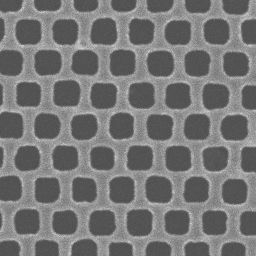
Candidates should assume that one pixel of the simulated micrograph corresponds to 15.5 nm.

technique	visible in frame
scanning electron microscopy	a regular array of holes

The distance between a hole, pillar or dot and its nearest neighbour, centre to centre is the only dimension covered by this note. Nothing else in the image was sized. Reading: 559 nm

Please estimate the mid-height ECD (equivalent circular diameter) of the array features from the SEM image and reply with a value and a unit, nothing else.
436 nanometers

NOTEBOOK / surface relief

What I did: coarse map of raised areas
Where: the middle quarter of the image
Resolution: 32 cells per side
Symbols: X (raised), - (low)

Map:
XX-------XX-------XXX-------XX--
XX-------XX-------XXX------XXX--
XXX-----XXXX-----XXXXX-----XXXX-
XXXXXXXXXXXXXXXXXXXXXXXXXXXXXXXX
---XXXXXXXXXXXXXXXXX-XXXXXXX-XXX
----XXX------XXXX-----XXXX------
----XXX------XXX-------XX-------
----XX-------XXX-------XX-------
----XXX------XXX-------XX-------
----XXX------XXX-------XX-------
---XXXX------XXXX-----XXXX------
XXXXXXXXX-XXXXXXXXXXXXXXXXXXXXXX
XXXX---XXXXXX---XXXXXX-XXXXXXXXX
XX------XXXX-----XXXX------XXXX-
XX------XXX-------XXX------XXX--
XX------XXX-------XXX------XXX--
XX------XXX-------XXX------XXX--
XX------XXX------XXXX------XXX--
XX-----XXXXX----XXXXXX-----XXX--
XXXXXXXXXXXXXXXXXXXXXXXXXXXXXXXX
--XXXXXXXXXXXXXXX----XXXXXX---XX
---XXXX-----XXXX------XXX-------
----XX-------XXX------XXX-------
----XX-------XXX------XXX-------
----XX-------XXX------XXX-------
----XXX-----XXXX------XXXX------
--XXXXXX----XXXX-----XXXXX-----X
XXXXXXXXXXXXXXXXXXXXXXXXXXXXXXXX
XXX----XXXXX-----XXXX-----XXXXX-
XX------XXX-------XX-------XXX--
XX------XXX-------XX-------XXX--
XX------XXX-------XX-------XXX--